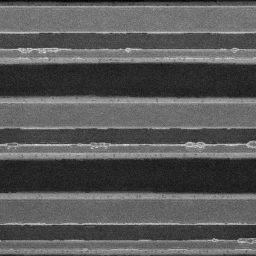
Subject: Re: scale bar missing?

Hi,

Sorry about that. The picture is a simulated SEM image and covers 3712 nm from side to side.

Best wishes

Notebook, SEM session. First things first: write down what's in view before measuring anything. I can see lines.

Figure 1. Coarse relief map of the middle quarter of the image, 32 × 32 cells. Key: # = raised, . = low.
................................
................................
................................
................................
................................
................................
................................
................................
................................
................................
################################
################################
################################
################################
################################
################################
################################
################################
################################
################################
################################
################################
##########################..###.
................................
................................
................................
................................
................................
................................
................................
................................
................................